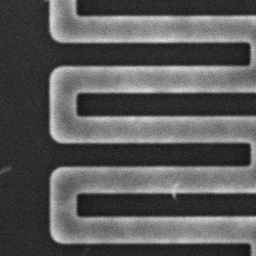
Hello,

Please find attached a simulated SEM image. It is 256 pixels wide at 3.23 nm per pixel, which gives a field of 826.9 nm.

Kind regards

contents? groups of lines, slits or small figures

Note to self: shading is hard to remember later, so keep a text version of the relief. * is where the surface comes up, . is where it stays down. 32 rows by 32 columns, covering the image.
......***.......................
......****......................
......**************************
......**************************
.......*************************
...............................*
...............................*
...............................*
.......*************************
......**************************
......**************************
......**************************
......***.......................
......***.......................
......****......................
......**************************
......**************************
.......*************************
...............................*
...............................*
...............................*
.......*************************
......**************************
......**************************
......****......................
......***.......................
......****......................
......**************************
......**************************
.......*************************
...............................*
...............................*